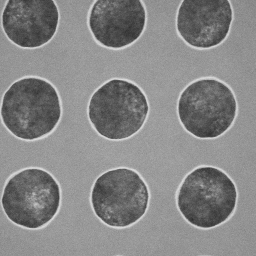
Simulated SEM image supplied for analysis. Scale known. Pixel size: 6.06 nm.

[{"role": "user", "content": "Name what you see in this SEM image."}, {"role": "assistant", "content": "holes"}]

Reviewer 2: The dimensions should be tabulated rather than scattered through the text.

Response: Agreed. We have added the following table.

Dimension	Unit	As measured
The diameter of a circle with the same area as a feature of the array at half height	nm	354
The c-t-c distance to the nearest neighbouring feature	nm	528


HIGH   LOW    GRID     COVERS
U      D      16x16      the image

DDDUUUDDDUUDDDUU
DDDDUUDDDUUDDDUU
UDDUUUDDUUUUDDUU
UUUUUUUUUUUUUUUU
UUUUUUUUUUUUUUUU
UDDUUUDDDUUUDDUU
DDDDUUDDDUUDDDDU
DDDDUUDDDUUDDDDU
UDDUUUUDUUUUDDUU
UUUUUUUUUUUUUUUU
UUUUUUUUUUUUDUUU
DDDDUUDDDUUDDDDU
DDDDUUDDDUUDDDDU
UDDUUUDDDUUUDDUU
UUUUUUUUUUUUUUUU
UUUUUUUUUUUUUUUU